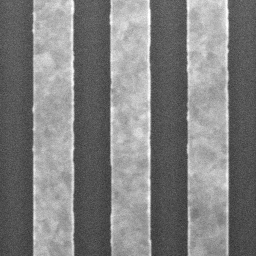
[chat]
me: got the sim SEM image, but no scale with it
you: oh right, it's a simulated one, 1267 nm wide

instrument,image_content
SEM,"lines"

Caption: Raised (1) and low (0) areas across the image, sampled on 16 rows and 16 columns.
0011100110001100
0011100110001100
0011100110001100
0011100110001100
0011100110001100
0011100110001100
0011100110001100
0011100110001100
0011100110001100
0011100110001100
0011100110001100
0011100110001100
0011100110001100
0011100110001100
0011100110001100
0011100110001100